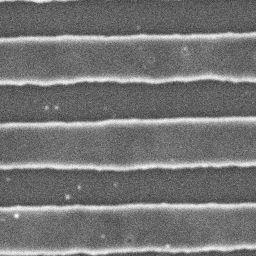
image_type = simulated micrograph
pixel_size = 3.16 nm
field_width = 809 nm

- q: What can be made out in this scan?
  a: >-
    lines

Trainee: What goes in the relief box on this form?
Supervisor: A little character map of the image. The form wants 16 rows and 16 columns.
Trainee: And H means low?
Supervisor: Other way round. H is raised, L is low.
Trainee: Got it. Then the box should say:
LLLLLLLLLLLLLLLL
LLLLLLLLLLLLLLLL
HHHHHHHHHHHHHHHH
HHHHHHHHHHHHHHHH
HHHHHHHHHHHHHHHH
LLLLLLLLLLLLLLLL
LLLLLLLLLLLLLLLL
LLLLLLLLLLHHHHHH
HHHHHHHHHHHHHHHH
HHHHHHHHHHHHHHHH
HLLLHHHHHLLLLLLL
LLLLLLLLLLLLLLLL
LLLLLLLLLLLLLLLL
HHHHHHHHHHHHHHHH
HHHHHHHHHHHHHHHH
HHHHHHHHHHHHHHHL